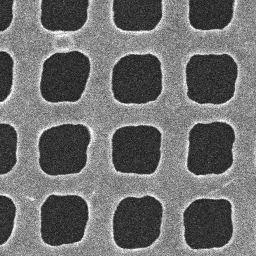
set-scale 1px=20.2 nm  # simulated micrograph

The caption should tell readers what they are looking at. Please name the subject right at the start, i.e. a regular array of holes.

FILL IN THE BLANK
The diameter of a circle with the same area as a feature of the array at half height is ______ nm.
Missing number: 1090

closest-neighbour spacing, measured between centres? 1.43 um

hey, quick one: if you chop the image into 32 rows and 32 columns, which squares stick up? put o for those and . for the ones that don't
..ooo......ooo......oooo.....ooo
..ooo......ooo......oooo.....ooo
..ooo......ooo......oooo.....ooo
.ooooo....ooooo....ooooo....oooo
oooooooooooooooooooooooooooooooo
oooooooooooooooooooooooooooooooo
.oooooo...oooooooooooooooooooooo
..oooo.....oooo.....oooo.....ooo
..ooo......ooo......ooo.......oo
..ooo......ooo......ooo.......oo
..ooo......ooo......ooo......ooo
.oooo.....oooo......ooo......ooo
.ooooo....ooooo....ooooo.....ooo
oooooooooooooooooooooooooooooooo
oooooooooooooooooooooooooooooooo
.ooooooo.oooooooooooooooo....ooo
..ooo......ooo......oooo.....ooo
..ooo......ooo......oooo.....ooo
..ooo......ooo......oooo.....ooo
..ooo......ooo......ooo......ooo
..ooo......ooo......ooo......ooo
.oooo.....ooooo....ooooo....oooo
oooooooooooooooooooooooooooooooo
oooooooooooooooooooooooooooooooo
.ooooo....oooooooo.ooooooooooooo
..ooo......oooo.....oooo.....ooo
..ooo......ooo......ooo......ooo
..ooo......ooo......ooo......ooo
..ooo......ooo......ooo......ooo
.oooo.....oooo......ooo......ooo
oooooo...ooooo.....oooo.....oooo
oooooooooooooooooooooooooooooooo